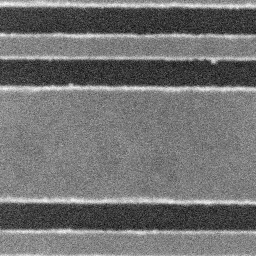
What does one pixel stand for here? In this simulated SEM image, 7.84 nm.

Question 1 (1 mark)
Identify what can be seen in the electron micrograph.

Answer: lines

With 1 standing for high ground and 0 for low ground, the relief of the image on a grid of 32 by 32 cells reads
11111111111111111111111111111111
00000000000000000000000000000000
00000000000000000000000000000000
00000000000000000000000000000000
11111111111111111111111111111111
11111111111111111111111111111111
11111111111111111111111111111111
00000000000000000000000000000000
00000000000000000000000000000000
00000000000000000000000000000000
00000000000000000000000000000000
11111111111111111111111111111111
11111111111111111111111111111111
11111111111111111111111111111111
11111111111111111111111111111111
11111111111111111111111111111111
11111111111111111111111111111111
11111111111111111111111111111111
11111111111111111111111111111111
11111111111111111111111111111111
11111111111111111111111111111111
11111111111111111111111111111111
11111111111111111111111111111111
11111111111111111111111111111111
11111111111111111111111111111111
00000000000000000000000000000000
00000000000000000000000000000000
00000000000000000000000000000000
00000000000000000000000000000000
11111111111111111111111111111111
11111111111111111111111111111111
11111111111111111111111111111111